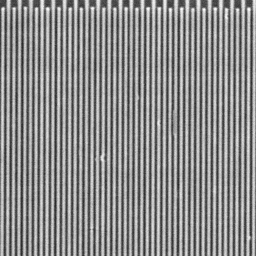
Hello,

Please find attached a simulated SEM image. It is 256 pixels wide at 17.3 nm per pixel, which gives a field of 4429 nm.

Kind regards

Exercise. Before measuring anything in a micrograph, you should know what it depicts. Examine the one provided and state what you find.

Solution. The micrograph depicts parallel lines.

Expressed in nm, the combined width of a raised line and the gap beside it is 96.6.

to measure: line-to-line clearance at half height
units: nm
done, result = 49.7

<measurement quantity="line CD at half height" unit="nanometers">49.7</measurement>